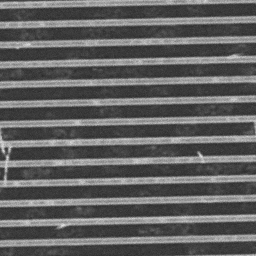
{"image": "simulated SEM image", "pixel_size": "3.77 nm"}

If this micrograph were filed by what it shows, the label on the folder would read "parallel lines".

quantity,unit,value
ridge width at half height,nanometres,17.9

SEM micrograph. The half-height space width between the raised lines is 57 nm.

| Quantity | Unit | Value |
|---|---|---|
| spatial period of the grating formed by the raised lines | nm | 74.8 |